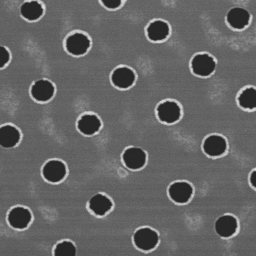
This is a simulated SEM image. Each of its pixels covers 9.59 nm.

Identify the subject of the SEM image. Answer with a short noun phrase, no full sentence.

a regular array of holes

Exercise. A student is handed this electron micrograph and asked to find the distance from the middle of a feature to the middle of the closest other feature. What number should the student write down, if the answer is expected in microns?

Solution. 0.545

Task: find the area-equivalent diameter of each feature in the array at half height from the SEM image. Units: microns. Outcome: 0.211